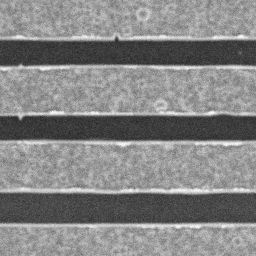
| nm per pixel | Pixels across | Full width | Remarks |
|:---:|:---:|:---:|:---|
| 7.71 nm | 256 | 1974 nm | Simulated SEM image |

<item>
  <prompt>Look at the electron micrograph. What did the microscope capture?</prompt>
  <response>one or a few lines or trenches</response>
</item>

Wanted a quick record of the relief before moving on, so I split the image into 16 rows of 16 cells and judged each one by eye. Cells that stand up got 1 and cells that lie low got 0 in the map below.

1111111111111111
1111111111111111
0000000000000000
0000000000000000
1111111111111111
1111111111111111
1111111111111111
0000000000000000
0000000000000000
1111111111111111
1111111111111111
1111111111111111
0000000000000000
0000000000000000
1111111111111111
1111111111111111